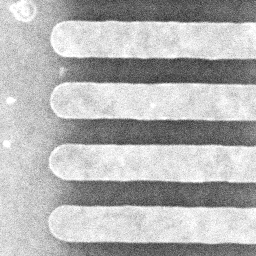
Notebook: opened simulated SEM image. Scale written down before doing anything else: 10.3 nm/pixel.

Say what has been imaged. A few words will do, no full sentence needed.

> groups of lines, slits or small figures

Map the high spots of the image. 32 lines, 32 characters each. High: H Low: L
LLLLLLLLLLLLLLLLLLLLLLLLLLLLLLLL
LLLLLLLLLLLLLLLLLLLLLLLLLLLLLLLL
LLLLLLLLLLLLLLLLLLLLLLLLLLLLLLLL
LLLLLLLHHHHHHHHHHHHHHHHHHHHHHHHH
LLLLLLHHHHHHHHHHHHHHHHHHHHHHHHHH
LLLLLLLHHHHHHHHHHHHHHHHHHHHHHHHH
LLLLLLLHHHHHHHHHHHHHHHHHHHHHHHHH
LLLLLLLLLLLLLLLLLLLLLLLLLLLLLLLL
LLLLLLLLLLLLLLLLLLLLLLLLLLLLLLLL
LLLLLLLLLLLLLLLLLLLLLLLLLLLLLLLL
LLLLLLLLHHHHHLLLLLLLLLLLLLLLLLLL
LLLLLLLHHHHHHHHHHHHHHHHHHHHHHHHH
LLLLLLHHHHHHHHHHHHHHHHHHHHHHHHHH
LLLLLLLHHHHHHHHHHHHHHHHHHHHHHHHH
LLLLLLLLHHHHHHHHHHHHHHHHHHHHHHHH
LLLLLLLLLLLLLLLLLLLLLLLLLLLLLLLL
LLLLLLLLLLLLLLLLLLLLLLLLLLLLLLLL
LLLLLLLLLLLLLLLLLLLLLLLLLLLLLLLL
LLLLLLLHHHHHHHHHHHHHHHHHHHHHHHHH
LLLLLLHHHHHHHHHHHHHHHHHHHHHHHHHH
LLLLLLHHHHHHHHHHHHHHHHHHHHHHHHHH
LLLLLLLHHHHHHHHHHHHHHHHHHHHHHHHH
LLLLLLLLLLLLLLHHHLLLHHHHHHHHHHHH
LLLLLLLLLLLLLLLLLLLLLLLLLLLLLLLL
LLLLLLLLLLLLLLLLLLLLLLLLLLLLLLLL
LLLLLLLLLLLLLLLLLLLLLLLLLLLLLLLL
LLLLLLLHHHHHHHHHHHHHHHHHHHHHHHHH
LLLLLLHHHHHHHHHHHHHHHHHHHHHHHHHH
LLLLLLHHHHHHHHHHHHHHHHHHHHHHHHHH
LLLLLLLHHHHHHHHHHHHHHHHHHHHHHHHH
LLLLLLLLLLLLLLLLLLLLLLLLLLLLLLLL
LLLLLLLLLLLLLLLLLLLLLLLLLLLLLLLL